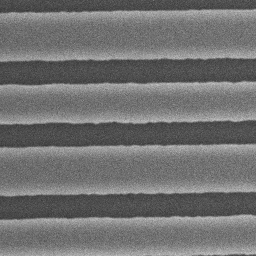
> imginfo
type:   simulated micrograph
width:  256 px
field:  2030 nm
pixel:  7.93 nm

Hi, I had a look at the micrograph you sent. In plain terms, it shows lines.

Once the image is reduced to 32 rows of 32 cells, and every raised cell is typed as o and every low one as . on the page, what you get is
................................
..............oooooooooooooooooo
oooooooooooooooooooooooooooooooo
oooooooooooooooooooooooooooooooo
oooooooooooooooooooooooooooooooo
oooooooooooooooooooooooooooooooo
oooooooooooooooooooooooooooooooo
oooo.ooo........................
................................
................................
.............o..o..ooooooooooooo
oooooooooooooooooooooooooooooooo
oooooooooooooooooooooooooooooooo
oooooooooooooooooooooooooooooooo
oooooooooooooooooooooooooooooooo
................................
................................
................................
...ooooooooooooooooooooooooooooo
oooooooooooooooooooooooooooooooo
oooooooooooooooooooooooooooooooo
oooooooooooooooooooooooooooooooo
oooooooooooooooooooooooooooooooo
oooooooooooooooooooooooooooooooo
................................
................................
................................
.ooooooooooooooooooooooooooooooo
oooooooooooooooooooooooooooooooo
oooooooooooooooooooooooooooooooo
oooooooooooooooooooooooooooooooo
oooooooooooooooooooooooooooooooo